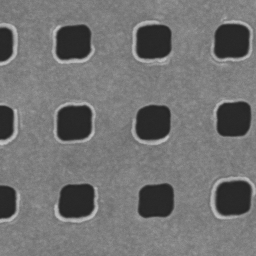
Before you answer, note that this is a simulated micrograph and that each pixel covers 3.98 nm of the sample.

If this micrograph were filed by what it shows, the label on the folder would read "a regular array of holes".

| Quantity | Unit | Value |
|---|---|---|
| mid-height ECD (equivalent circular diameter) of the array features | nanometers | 146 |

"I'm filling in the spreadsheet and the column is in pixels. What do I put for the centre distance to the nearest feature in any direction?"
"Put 78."